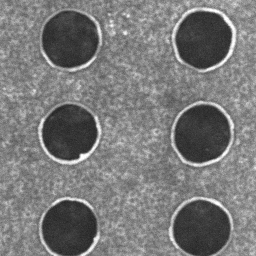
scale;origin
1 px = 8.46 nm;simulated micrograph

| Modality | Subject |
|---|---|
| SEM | holes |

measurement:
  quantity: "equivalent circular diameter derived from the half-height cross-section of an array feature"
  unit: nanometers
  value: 494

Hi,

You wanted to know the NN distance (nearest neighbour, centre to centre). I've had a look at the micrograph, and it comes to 93.6 pixels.